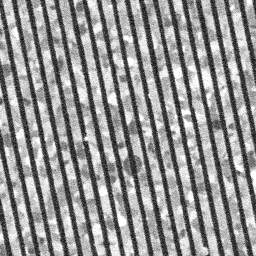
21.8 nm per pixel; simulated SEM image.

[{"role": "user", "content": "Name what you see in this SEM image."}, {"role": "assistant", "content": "parallel lines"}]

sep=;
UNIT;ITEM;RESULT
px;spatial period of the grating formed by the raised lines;13.9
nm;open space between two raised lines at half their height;131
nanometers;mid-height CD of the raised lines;176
